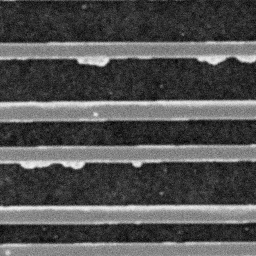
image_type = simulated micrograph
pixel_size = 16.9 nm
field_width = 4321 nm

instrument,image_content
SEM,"lines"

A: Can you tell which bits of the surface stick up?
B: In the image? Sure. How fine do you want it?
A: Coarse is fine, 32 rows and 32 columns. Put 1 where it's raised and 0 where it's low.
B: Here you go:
00000000000000000000000000000000
00000000000000000000000000000000
00000000000000000000000000000000
00000000000000000000000000000000
00000000000000000000000000000000
00000011111111111111111111111111
11111111111111111111111111111111
00000000001111000000000000110011
00000000000000000000000000000000
00000000000000000000000000000000
00000000000000000000000000000000
00000000000000000000000000000000
00000000000000000000000000000000
11111111111111111111111111111111
11111111111111111111111111111111
00000000000000000000000000000000
00000000000000000000000000000000
00000000000000000000000000000000
11111111111111111111111111111111
11111111111111111111111111111111
00011100111000000100000000000000
00000000000000000000000000000000
00000000000000000000000000000000
00000000000000000000000000000000
00000000000000000000000000000000
00000000000000000000000000000000
11111111111111111111111111111111
11111111111111111111111111111111
00000000000000000000000000000000
00000000000000000000000000000000
00000000001111111111111111111111
11111111111111111111111111111111